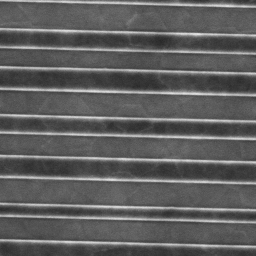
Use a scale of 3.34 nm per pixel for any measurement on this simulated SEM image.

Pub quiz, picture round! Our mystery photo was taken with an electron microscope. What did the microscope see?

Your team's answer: parallel lines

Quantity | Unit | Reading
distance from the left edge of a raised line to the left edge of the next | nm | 143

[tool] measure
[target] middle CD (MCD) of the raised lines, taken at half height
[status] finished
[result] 61.8 nanometers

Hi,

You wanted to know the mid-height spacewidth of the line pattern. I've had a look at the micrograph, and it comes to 0.0828 microns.